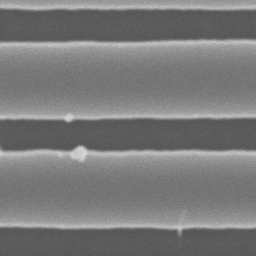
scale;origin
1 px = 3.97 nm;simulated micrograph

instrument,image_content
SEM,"lines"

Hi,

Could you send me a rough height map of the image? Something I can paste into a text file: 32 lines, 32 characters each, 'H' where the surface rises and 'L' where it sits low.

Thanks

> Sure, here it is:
HHHHHHHHHHHHHHHHHHHHHHHHHHHHHHHH
LLLLLLLLLLLLLLLLLLLLLLLLLLLLLLLL
LLLLLLLLLLLLLLLLLLLLLLLLLLLLLLLL
LLLLLLLLLLLLLLLLLLLLLLLLLLLLLLLL
LLLLLLLLLLLLLLLLLLLLLLLLLLLLLLLL
HHHHHHHHHHHHHHHHHHHHHHHHHHHHHHHH
HHHHHHHHHHHHHHHHHHHHHHHHHHHHHHHH
HHHHHHHHHHHHHHHHHHHHHHHHHHHHHHHH
HHHHHHHHHHHHHHHHHHHHHHHHHHHHHHHH
HHHHHHHHHHHHHHHHHHHHHHHHHHHHHHHH
HHHHHHHHHHHHHHHHHHHHHHHHHHHHHHHH
HHHHHHHHHHHHHHHHHHHHHHHHHHHHHHHH
HHHHHHHHHHHHHHHHHHHHHHHHHHHHHHHH
HHHHHHHHHHHHHHHHHHHHHHHHHHHHHHHH
HHHHHHHHHHHHHHHHHHHHHHHHHHHHHHHH
LLLLLLLLLLLLLLLLLLLLLLLLLLLLLLLL
LLLLLLLLLLLLLLLLLLLLLLLLLLLLLLLL
LLLLLLLLLLLLLLLLLLLLLLLLLLLLLLLL
LLLLLLLLLLHLLLLLLLLLLLLLLLLLLLLL
HHHHHHHHHHHHHHHHHHHHHHHHHHHHHHHH
HHHHHHHHHHHHHHHHHHHHHHHHHHHHHHHH
HHHHHHHHHHHHHHHHHHHHHHHHHHHHHHHH
HHHHHHHHHHHHHHHHHHHHHHHHHHHHHHHH
HHHHHHHHHHHHHHHHHHHHHHHHHHHHHHHH
HHHHHHHHHHHHHHHHHHHHHHHHHHHHHHHH
HHHHHHHHHHHHHHHHHHHHHHHHHHHHHHHH
HHHHHHHHHHHHHHHHHHHHHHHHHHHHHHHH
HHHHHHHHHHHHHHHHHHHHHHHHHHHHHHHH
LLLLLLLHHHHHHHHLLLLHHHHHLLHHHHHH
LLLLLLLLLLLLLLLLLLLLLLLLLLLLLLLL
LLLLLLLLLLLLLLLLLLLLLLLLLLLLLLLL
LLLLLLLLLLLLLLLLLLLLLLLLLLLLLLLL